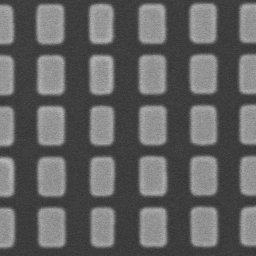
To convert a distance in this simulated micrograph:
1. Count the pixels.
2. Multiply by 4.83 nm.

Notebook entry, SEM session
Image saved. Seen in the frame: wiring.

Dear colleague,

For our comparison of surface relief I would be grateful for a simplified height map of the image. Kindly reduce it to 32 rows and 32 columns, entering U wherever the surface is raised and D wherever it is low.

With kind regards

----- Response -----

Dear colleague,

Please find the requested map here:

DDDDDDDDDDDDDDDDDDDDDDDDDDDDDDDD
UDDDDUUUDDDUUUDDDDUUDDDDUUUDDDUU
UDDDDUUUDDDUUUDDDDUUDDDDUUUDDDUU
UDDDDUUUDDDUUUDDDDUUDDDDUUUDDDUU
UDDDDUUUDDDUUUDDDDUUDDDDUUUDDDUU
DDDDDDDDDDDDDDDDDDDDDDDDDDDDDDDD
DDDDDDDDDDDDDDDDDDDDDDDDDDDDDDDD
UDDDDUUUDDDUUUDDDDUUDDDDUUUDDDUU
UUDDDUUUDDDUUUDDDDUUUDDDUUUDDDUU
UUDDDUUUDDDUUUDDDDUUUDDDUUUDDDUU
UUDDDUUUDDDUUUDDDDUUUDDDUUUDDDUU
UDDDDUUUDDDDUUDDDDUUDDDDUUDDDDUU
DDDDDDDDDDDDDDDDDDDDDDDDDDDDDDDD
UDDDDUUDDDDDUUDDDDUUDDDDUUUDDDUU
UUDDDUUUDDDUUUDDDDUUUDDDUUUDDDUU
UUDDDUUUDDDUUUDDDDUUUDDDUUUDDDUU
UUDDDUUUDDDUUUDDDDUUUDDDUUUDDDUU
UUDDDUUUDDDUUUDDDDUUUDDDUUUDDDUU
DDDDDDDDDDDDDDDDDDDDDDDDDDDDDDDD
DDDDDDDDDDDDDDDDDDDDDDDDDDDDDDDD
DUDDDUUUDDDUUUDDDDUUUDDDUUUDDDUU
DDDDDUUUDDDUUUDDDDUUUDDDUUUDDDUU
UUDDDUUUDDDUUUDDDDUUUDDDUUUDDDUU
UUDDDUUUDDDUUUDDDDUUUDDDUUUDDDUU
DDDDDDDDDDDDDDDDDDDDDDDDDDDDDDDD
DDDDDDDDDDDDDDDDDDDDDDDDDDDDDDDD
UDDDDUUUDDDDUUDDDDUUUDDDUUUDDDUU
UUDDDUUUDDDUUUDDDDUUUDDDUUUDDDUU
UUDDDUUUDDDUUUDDDDUUUDDDUUUDDDUU
UUDDDUUUDDDUUUDDDDUUUDDDUUUDDDUU
UDDDDUUUDDDDUUDDDDUUDDDDUUUDDDUU
DDDDDDDDDDDDDDDDDDDDDDDDDDDDDDDD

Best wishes